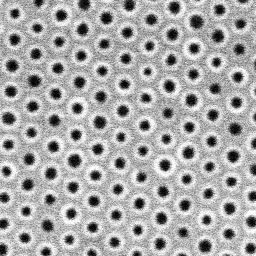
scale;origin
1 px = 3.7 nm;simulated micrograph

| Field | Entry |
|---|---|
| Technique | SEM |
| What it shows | a regular array of holes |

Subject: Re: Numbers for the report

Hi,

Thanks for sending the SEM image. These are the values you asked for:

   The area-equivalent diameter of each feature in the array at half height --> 43.9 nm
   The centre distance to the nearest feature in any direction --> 94.6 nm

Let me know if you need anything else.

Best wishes